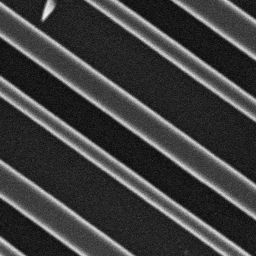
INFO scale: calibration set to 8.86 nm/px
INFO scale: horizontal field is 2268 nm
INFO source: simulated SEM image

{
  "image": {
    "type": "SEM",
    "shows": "lines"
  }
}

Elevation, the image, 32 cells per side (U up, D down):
DDDDDDDDDDDUUUUDDDDDDDUUUUUUUDDD
UUDDDDDDDDDDDUUUUDDDDDDDUUUUUUDD
UUUDDDDDDDDDDDUUUUDDDDDDDUUUUUUU
UUUUDDDDDDDDDDDDUUUDDDDDDDUUUUUU
UUUUUUDDDDDDDDDDDUUUUDDDDDDDUUUU
DUUUUUUDDDDDDDDDDDUUUUDDDDDDDUUU
DDDUUUUUUDDDDDDDDDDDUUUUDDDDDDDU
DDDDUUUUUUDDDDDDDDDDDUUUUDDDDDDD
DDDDDDUUUUUDDDDDDDDDDDDUUUDDDDDD
DDDDDDDUUUUUUDDDDDDDDDDDUUUUDDDD
UDDDDDDDUUUUUUDDDDDDDDDDDUUUUDDD
UUUDDDDDDDUUUUUUDDDDDDDDDDDUUUUD
DUUUDDDDDDDUUUUUUDDDDDDDDDDDUUUU
DDUUUDDDDDDDUUUUUUDDDDDDDDDDDDUU
DDDDUUUDDDDDDDUUUUUUDDDDDDDDDDDU
DDDDDUUUDDDDDDDUUUUUUDDDDDDDDDDD
DDDDDDUUUUDDDDDDDUUUUUUDDDDDDDDD
DDDDDDDDUUUDDDDDDDUUUUUUDDDDDDDD
DDDDDDDDDUUUDDDDDDDDUUUUUDDDDDDD
DDDDDDDDDDDUUUDDDDDDDUUUUUUDDDDD
UDDDDDDDDDDDUUUDDDDDDDUUUUUUDDDD
UUDDDDDDDDDDDUUUUDDDDDDDUUUUUUDD
UUUDDDDDDDDDDDDUUUDDDDDDDUUUUUUD
UUUUUDDDDDDDDDDDUUUDDDDDDDUUUUUU
UUUUUUDDDDDDDDDDDDUUUDDDDDDDUUUU
DUUUUUUUDDDDDDDDDDDUUUDDDDDDDUUU
DDDUUUUUUDDDDDDDDDDDUUUUDDDDDDDU
DDDDUUUUUUDDDDDDDDDDDDUUUDDDDDDD
DDDDDUUUUUUUDDDDDDDDDDDUUUDDDDDD
DDDDDDDUUUUUUDDDDDDDDDDDDUUUDDDD
UDDDDDDDUUUUUUUDDDDDDDDDDDUUUDDD
UUDDDDDDDDUUUUUUDDDDDDDDDDDUUUUD